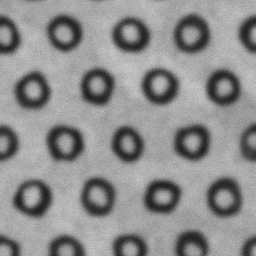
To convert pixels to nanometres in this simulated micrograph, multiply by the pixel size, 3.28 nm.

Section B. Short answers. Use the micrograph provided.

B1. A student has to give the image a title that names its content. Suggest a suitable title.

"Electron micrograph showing a regular array of ring-shaped grooves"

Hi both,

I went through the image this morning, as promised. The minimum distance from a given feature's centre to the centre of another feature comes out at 0.201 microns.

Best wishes